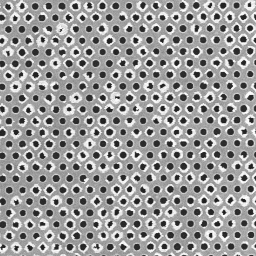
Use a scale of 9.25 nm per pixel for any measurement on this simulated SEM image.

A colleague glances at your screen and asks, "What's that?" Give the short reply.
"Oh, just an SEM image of a regular array of holes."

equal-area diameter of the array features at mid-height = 6.49 pixels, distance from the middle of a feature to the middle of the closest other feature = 119 nanometres